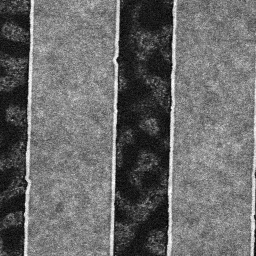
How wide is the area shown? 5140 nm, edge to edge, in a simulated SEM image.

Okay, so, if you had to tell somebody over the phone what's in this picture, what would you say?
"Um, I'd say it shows one or a few lines or trenches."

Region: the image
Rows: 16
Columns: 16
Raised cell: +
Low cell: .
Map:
..+++++....+++++
..+++++....+++++
..+++++....+++++
..+++++....+++++
..+++++....+++++
..+++++....+++++
..+++++....+++++
..+++++....+++++
..+++++....+++++
..+++++....+++++
..+++++....+++++
..+++++....+++++
..+++++....+++++
..+++++....+++++
..+++++....+++++
..+++++....+++++